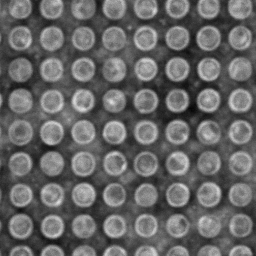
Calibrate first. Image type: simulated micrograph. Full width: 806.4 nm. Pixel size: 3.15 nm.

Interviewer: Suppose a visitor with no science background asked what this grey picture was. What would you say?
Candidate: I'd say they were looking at a regular array of raised bodies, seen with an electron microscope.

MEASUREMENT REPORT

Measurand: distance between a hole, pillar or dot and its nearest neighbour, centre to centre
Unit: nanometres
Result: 98.1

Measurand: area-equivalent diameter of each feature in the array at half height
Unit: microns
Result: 0.0715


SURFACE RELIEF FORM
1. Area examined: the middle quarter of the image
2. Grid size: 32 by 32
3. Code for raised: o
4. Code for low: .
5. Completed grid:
..ooooo...ooooo...ooooo...ooooo.
..ooooo...ooooo...ooooo...ooooo.
..ooooo...ooooo...ooooo...ooooo.
...ooo.....oooo....ooo....oooo..
................................
................................
................................
...oooo....oooo...ooooo...ooooo.
..ooooo...ooooo...ooooo...ooooo.
..ooooo...ooooo...ooooo...ooooo.
..ooooo...ooooo...ooooo...ooooo.
...ooo.....ooo.....ooo.....ooo..
................................
................................
....oo......o.......o......ooo..
...oooo....oooo...ooooo...ooooo.
..oooooo..ooooo...ooooo...ooooo.
..oooooo..ooooo...ooooo...ooooo.
..ooooo...ooooo...ooooo...ooooo.
...ooo.....ooo.....ooo.....ooo..
................................
................................
...ooo.....ooo.....ooo......o...
..ooooo...ooooo...ooooo...ooooo.
..oooooo..ooooo...ooooo...ooooo.
..oooooo..ooooo...ooooo...ooooo.
...oooo....oooo...ooooo...ooooo.
...ooo.....ooo.....ooo......o...
................................
................................
...ooo.....ooo.....ooo.....ooo..
...oooo...ooooo...ooooo...ooooo.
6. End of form